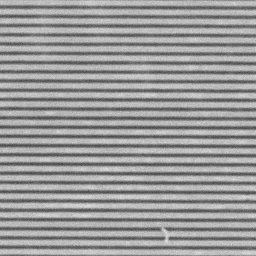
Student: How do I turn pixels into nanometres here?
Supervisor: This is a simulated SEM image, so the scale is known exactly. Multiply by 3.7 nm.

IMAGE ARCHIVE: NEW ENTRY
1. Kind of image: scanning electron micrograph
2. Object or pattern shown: parallel lines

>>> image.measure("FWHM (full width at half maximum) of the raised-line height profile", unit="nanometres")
18.5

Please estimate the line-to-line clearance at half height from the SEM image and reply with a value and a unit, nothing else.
15.7 nanometers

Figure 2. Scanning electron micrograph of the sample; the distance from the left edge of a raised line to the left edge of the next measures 34.2 nm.